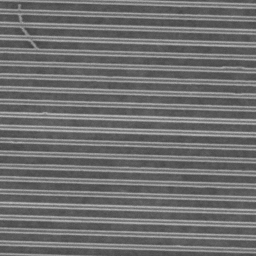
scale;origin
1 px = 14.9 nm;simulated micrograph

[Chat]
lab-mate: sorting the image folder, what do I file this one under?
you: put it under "parallel lines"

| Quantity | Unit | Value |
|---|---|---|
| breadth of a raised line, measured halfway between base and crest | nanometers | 55.8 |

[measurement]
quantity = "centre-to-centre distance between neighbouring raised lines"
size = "191 nm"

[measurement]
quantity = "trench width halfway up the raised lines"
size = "0.125 micrometres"